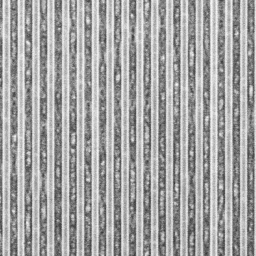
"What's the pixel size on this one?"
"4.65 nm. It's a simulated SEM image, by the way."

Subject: parallel lines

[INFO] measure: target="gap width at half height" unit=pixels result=8.37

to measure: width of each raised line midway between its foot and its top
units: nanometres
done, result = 31.4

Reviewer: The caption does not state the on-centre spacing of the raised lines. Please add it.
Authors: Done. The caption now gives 68.8 nm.